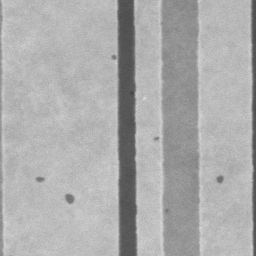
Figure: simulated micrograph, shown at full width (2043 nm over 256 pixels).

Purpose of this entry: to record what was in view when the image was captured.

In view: lines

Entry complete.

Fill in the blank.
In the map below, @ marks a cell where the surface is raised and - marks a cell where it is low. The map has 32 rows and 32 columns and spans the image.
@@@@@@@@@@@@@@@--@@@-----@@@@@@-
@@@@@@@@@@@@@@@--@@@-----@@@@@@-
@@@@@@@@@@@@@@@--@@@-----@@@@@@-
@@@@@@@@@@@@@@@--@@@-----@@@@@@-
@@@@@@@@@@@@@@@--@@@-----@@@@@@-
@@@@@@@@@@@@@@@--@@@-----@@@@@@-
@@@@@@@@@@@@@@@--@@@-----@@@@@@-
@@@@@@@@@@@@@@@--@@@-----@@@@@@-
@@@@@@@@@@@@@@@--@@@-----@@@@@@-
@@@@@@@@@@@@@@@--@@@-----@@@@@@@
@@@@@@@@@@@@@@@--@@@-----@@@@@@@
@@@@@@@@@@@@@@@--@@@-----@@@@@@@
@@@@@@@@@@@@@@@--@@@-----@@@@@@@
@@@@@@@@@@@@@@@--@@@-----@@@@@@-
@@@@@@@@@@@@@@@--@@@-----@@@@@@-
@@@@@@@@@@@@@@@--@@@-----@@@@@@@
@@@@@@@@@@@@@@@--@@@-----@@@@@@@
@@@@@@@@@@@@@@@--@@@-----@@@@@@-
@@@@@@@@@@@@@@@--@@@-----@@@@@@@
@@@@@@@@@@@@@@@--@@@-----@@@@@@@
@@@@@@@@@@@@@@@--@@@-----@@@@@@@
@@@@@@@@@@@@@@@--@@@-----@@@@@@@
@@@@@@@@@@@@@@@--@@@-----@@@@@@@
@@@@@@@@@@@@@@@--@@@-----@@@@@@@
@@@@@@@@@@@@@@@--@@@-----@@@@@@@
@@@@@@@@@@@@@@@--@@@-----@@@@@@@
@@@@@@@@@@@@@@@--@@@-----@@@@@@@
@@@@@@@@@@@@@@@--@@@-----@@@@@@@
-@@@@@@@@@@@@@@--@@@-----@@@@@@@
-@@@@@@@@@@@@@@--@@@-----@@@@@@@
-@@@@@@@@@@@@@@--@@@-----@@@@@@@
-@@@@@@@@@@@@@@--@@@-----@@@@@@@